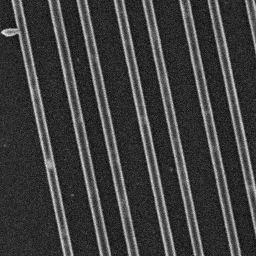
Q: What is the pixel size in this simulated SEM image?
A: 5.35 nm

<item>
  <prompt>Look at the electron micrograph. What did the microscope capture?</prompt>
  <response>parallel lines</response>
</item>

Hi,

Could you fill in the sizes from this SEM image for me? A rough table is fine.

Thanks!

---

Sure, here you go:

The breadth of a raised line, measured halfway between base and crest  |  44.6 nm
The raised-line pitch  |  32.3 pixels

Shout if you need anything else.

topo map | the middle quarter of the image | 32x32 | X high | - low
XX-----XX-------XX-----XX-------
XX-----XX-------XX-----XX-------
XX-----XX-------XX-----XXX------
XXX----XX--------XX-----XX------
-XX-----XX-------XX-----XX------
-XX-----XX-------XX-----XX------
-XX-----XX-------XX-----XX------
-XX-----XX-------XX-----XXX-----
-XX-----XX--------XX-----XX-----
--XX-----XX-------XX-----XX-----
--XX-----XX-------XX-----XX-----
--XX-----XX-------XX-----XX-----
--XX-----XX-------XX------XX----
--XXX----XX--------XX-----XX----
---XX-----XX-------XX-----XX----
---XX-----XX-------XX-----XX----
---XX-----XX-------XX-----XX----
---XX-----XX-------XX------XX---
---XXX----XX--------XX-----XX---
----XX-----XX-------XX-----XX---
----XX-----XX-------XX-----XX---
----XX-----XX-------XX-----XX---
----XX-----XX-------XXX-----XX--
----XXX----XXX-------XX-----XX--
-----XX-----XX-------XX-----XX--
-----XX-----XX-------XX-----XX--
-----XX-----XX-------XX-----XX--
-----XX-----XX--------XX-----XX-
-----XX------XX-------XX-----XX-
------XX-----XX-------XX-----XX-
------XX-----XX-------XX-----XX-
------XX-----XX-------XX-----XX-